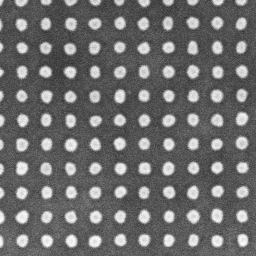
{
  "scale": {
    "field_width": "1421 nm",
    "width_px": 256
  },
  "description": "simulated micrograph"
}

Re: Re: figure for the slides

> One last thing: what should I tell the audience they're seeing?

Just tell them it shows a regular array of raised bodies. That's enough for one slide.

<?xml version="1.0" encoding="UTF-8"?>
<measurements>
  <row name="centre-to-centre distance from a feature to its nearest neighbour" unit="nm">131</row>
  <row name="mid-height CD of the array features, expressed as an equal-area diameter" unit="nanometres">58.8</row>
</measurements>